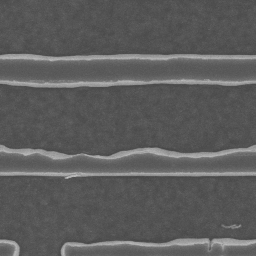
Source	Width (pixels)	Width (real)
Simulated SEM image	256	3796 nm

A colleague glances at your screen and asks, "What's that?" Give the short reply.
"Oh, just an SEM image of one or a few lines or trenches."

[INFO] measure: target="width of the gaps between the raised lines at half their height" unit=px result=68.7